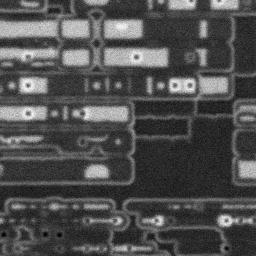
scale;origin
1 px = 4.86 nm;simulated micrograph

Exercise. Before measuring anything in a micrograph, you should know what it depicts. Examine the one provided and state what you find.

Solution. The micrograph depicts wiring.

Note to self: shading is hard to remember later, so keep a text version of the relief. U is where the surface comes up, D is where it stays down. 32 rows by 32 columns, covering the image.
UUUUUUDDDUUUUUUUUUUUUUUUUUUUUUUU
DDDDDDDDDUUUUUUUUUUUUUUUUUUUUUUU
DDDDDDDUUUUUUUUUUUUUUUUUUUUUUDDD
DDDDDDDUUUUUUUUUUUUUUUUUUUUUUDDD
DDDDDDDUUUUUUUUUUUUUUUUUUUUUUDDD
DDDDDDDUUUUUDUUUUUUUUUUUUUUUUDDD
DDDDDDDUUUUUUUUUUUUUUUUUUUUUUDDD
UUDDDDDUUUUUUUUUUUUUUUUUUUUUUDDD
UUDDDDDUUUUUDUUUUUUUUUUUUUUUUDDD
UUUUUUUUUUUUUUUUUUUUUUUUUDDDDDDD
UUUUUUUUUUUUUUUUUUUUUUUUUDDDDDDD
UUUUUUUUUUUUUUUUUUUUUUUUUDDDDDDD
UUUUUUUUUUUUUUUUUDDDDDDDDDDDDDDD
UUUUUUUUUUUUUUUUUDDDDDDDDDDDDDDD
UUUUUUUUUUUUUUUUUDDDDDDDDDDDDUUU
UUUUUUUUUUUUUUUUUDDDDDDDDDDDDDUU
UUUUUUUUUUUUUUUUUDDDDDDDDDDDDUUU
UUUUUUUUUUUUUUUUUDDDDDDDDDDDDUUU
DDDDDDDUUUUUUUUUUDDDDDDDDDDDDUUU
DDDDDDDDUUUDDUUUDDDDDDDDDDDDDUUU
UUUUUUUUUUUUUUUUUDDDDDDDDDDDDUUU
UUUUUUUUUUUUUUUUUDDDDDDDDDDDDUUU
UUUUUUUUUUUUUUUUUDDDDDDDDDDDDUUU
DDDDDDDDDDDDDDDDDDDDDDDDDDDDDDDD
DDDDDDDDDDDDDDDDDDDDDDDDDDDDDDDD
DUUUUUUUUUUUUUDDUUUUUUUUUUUUUUUU
UUUUUUUUUUUUUUUUUUUUUUUUUUUUUUUU
UUUUUUUUUUUUUUUUDUUUUUUUUUUUUUUU
UUUUUUUUUUUUUUUUDDDUUUDDDDUUUUUU
UUDDUUUUUUUUUUDDDDDDDDDDDDDDUUUU
UUUUUUUUUUUUUUDDDDDDDDDDDDDDUUUU
DUUUUUUUUUUUUUDDDDDDDDDDDDDDUUUU